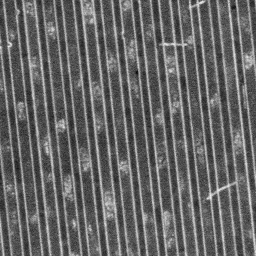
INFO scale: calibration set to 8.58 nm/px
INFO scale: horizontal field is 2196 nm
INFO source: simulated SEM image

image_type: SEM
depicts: parallel lines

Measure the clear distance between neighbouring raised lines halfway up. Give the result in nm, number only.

92.7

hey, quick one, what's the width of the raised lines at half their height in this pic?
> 70.3 nanometers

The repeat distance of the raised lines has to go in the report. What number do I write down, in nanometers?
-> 166